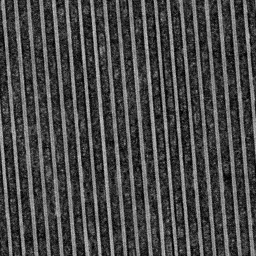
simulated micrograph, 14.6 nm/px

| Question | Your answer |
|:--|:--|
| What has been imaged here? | parallel lines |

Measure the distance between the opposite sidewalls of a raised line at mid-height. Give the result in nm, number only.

38.2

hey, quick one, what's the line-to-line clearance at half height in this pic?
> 138 nm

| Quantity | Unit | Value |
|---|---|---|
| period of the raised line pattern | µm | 0.185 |